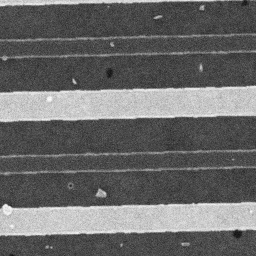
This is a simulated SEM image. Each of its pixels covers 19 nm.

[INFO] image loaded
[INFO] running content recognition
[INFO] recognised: lines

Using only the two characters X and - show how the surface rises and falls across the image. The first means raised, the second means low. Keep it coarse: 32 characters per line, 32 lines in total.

X-------------------------------
--------------------------------
--------------------------------
--------------------------------
------------------------XXXXXXXX
XXXXXXXXXXXXXXXXXXXXXXXXXXXXXXXX
XXXXXXXXXXXXXXXXXXXXXXXXXXXX----
--------------------------------
--------------------------------
--------------------------------
--------------------------------
-----------XXXXXXXXXXXXXXXXXXXXX
XXXXXXXXXXXXXXXXXXXXXXXXXXXXXXXX
XXXXXXXXXXXXXXXXXXXXXXXXXXXXXXXX
XXXXXXXXXXXXXXXXXXXXXX----------
--------------------------------
--------------------------------
--------------------------------
--------------------------------
--XXXXXXXXXXXXXXXXXXXXXXXXXXXXXX
XXXXXXXXXXXXXXXXXXXXXXXXXXXXXXXX
XXXXXXXXX-----------------------
--------------------------------
--------------------------------
--------------------------------
----------------------------X-XX
XXXXXXXXXXXXXXXXXXXXXXXXXXXXXXXX
XXXXXXXXXXXXXXXXXXXXXXXXXXXXXXXX
XXXXXXXXXXXXXXXXXXXXXXXXXXXXX---
--------------------------------
--------------------------------
--------------------------------